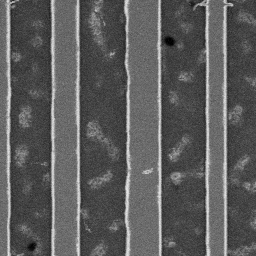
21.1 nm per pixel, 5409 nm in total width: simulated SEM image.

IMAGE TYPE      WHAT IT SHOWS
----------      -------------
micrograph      one or a few lines or trenches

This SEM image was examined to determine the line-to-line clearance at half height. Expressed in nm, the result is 1020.